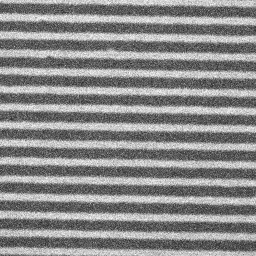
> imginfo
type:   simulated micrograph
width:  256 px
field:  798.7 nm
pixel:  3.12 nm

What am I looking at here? parallel lines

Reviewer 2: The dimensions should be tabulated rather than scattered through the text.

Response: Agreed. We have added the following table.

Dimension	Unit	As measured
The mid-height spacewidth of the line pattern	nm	39.3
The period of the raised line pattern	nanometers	56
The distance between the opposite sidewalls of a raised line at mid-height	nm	18.3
